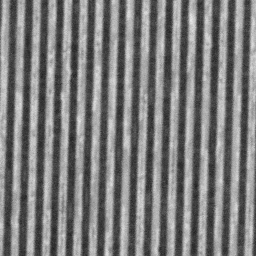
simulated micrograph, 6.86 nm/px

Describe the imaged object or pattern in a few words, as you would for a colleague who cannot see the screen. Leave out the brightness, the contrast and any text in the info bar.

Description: parallel lines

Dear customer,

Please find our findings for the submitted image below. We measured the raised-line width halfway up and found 49.7 nm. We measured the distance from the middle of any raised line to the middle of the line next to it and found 107 nanometers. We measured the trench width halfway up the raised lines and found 56.6 nm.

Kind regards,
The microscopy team